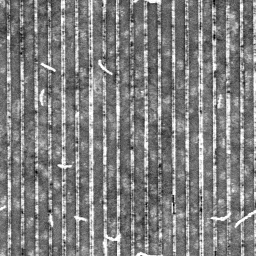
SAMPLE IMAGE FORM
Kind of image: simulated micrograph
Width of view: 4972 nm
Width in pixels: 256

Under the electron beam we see parallel lines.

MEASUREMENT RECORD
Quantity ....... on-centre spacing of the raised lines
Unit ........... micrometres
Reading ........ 0.266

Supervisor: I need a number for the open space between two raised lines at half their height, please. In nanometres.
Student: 223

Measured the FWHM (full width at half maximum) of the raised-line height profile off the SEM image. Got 0.051 micrometres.